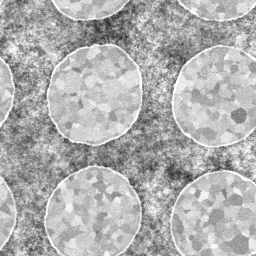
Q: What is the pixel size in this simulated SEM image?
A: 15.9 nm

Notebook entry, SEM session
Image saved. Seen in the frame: raised bodies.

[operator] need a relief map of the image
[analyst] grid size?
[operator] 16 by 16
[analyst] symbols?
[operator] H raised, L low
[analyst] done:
LLLLHHHHLLLLHHHH
LLLLLLLLLLLLLLLL
LLLLLLLLLLLLLLLL
LLLLHHHHLLLLHHHH
HLLHHHHHHLLHHHHH
HLLHHHHHHLLHHHHH
HLLHHHHHHLLHHHHH
LLLHHHHHLLLHHHHH
LLLLHHHLLLLLHHHL
LLLLLLLLLLLLLLLL
LLLLLHHLLLLLLLLL
LLLLHHHHLLLLHHHH
HLLHHHHHHLLHHHHH
HLLHHHHHHLLHHHHH
HLLHHHHHHLLHHHHH
LLLLHHHHLLLHHHHH